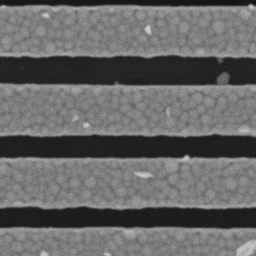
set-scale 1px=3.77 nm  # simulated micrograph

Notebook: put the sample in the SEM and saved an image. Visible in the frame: lines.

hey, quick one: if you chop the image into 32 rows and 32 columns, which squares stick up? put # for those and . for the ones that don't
................................
################################
################################
################################
################################
################################
################################
................................
................................
................................
................................
################################
################################
################################
################################
################################
################################
................................
................................
................................
################################
################################
################################
################################
################################
################################
................................
................................
.###.##...########.####.........
################################
################################
################################